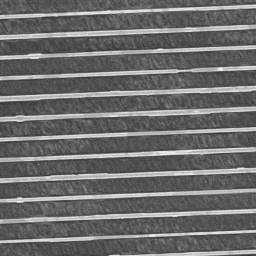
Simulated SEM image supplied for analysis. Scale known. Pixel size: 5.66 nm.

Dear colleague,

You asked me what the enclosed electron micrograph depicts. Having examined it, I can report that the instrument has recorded parallel lines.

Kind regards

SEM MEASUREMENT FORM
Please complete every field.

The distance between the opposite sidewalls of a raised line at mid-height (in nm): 19.8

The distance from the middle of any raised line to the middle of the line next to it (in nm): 116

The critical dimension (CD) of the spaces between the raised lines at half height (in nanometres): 92.6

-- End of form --